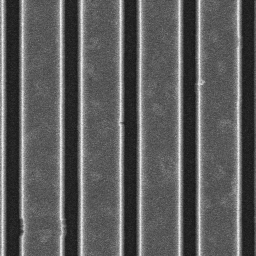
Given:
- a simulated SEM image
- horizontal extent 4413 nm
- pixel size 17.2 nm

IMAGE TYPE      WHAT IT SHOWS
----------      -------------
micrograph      parallel lines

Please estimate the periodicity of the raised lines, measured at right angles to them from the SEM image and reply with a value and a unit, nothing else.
1020 nm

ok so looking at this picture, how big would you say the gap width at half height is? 287 nm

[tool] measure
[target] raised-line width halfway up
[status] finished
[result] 733 nm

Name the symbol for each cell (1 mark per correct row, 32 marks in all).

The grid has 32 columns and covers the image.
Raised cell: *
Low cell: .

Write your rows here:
...*****..*****..******..*****..
...*****..*****..******..*****..
...*****..*****..******..*****..
...*****..*****..******..*****..
...*****..*****..******..*****..
...*****..*****..******..*****..
...*****..*****..******..*****..
...*****..*****..******..*****..
...*****..*****..******..*****..
...*****..*****..******..*****..
...*****..*****..******..*****..
...*****..*****..******..*****..
...*****..*****..******..*****..
...*****..*****..******..*****..
...*****..*****..******..*****..
...*****..*****..******..*****..
...*****..*****..******..*****..
...*****..*****..******..*****..
...*****..*****..******..*****..
...*****..*****..******..*****..
...*****..*****..******..*****..
...*****..*****..******..*****..
...*****..*****..******..*****..
...*****..*****..******..*****..
...*****..*****..******..*****..
...*****..*****..******..*****..
...*****..*****..******..*****..
...*****..*****..******..*****..
...*****..*****..******..*****..
...*****..*****..******..*****..
...*****..*****..******..*****..
...*****..*****..******..*****..